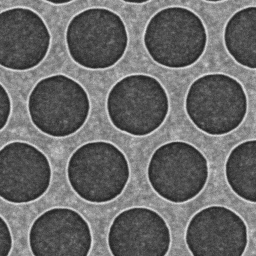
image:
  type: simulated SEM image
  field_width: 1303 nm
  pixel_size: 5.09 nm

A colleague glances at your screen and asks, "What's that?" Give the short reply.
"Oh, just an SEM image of holes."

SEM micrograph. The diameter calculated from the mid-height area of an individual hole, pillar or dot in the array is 316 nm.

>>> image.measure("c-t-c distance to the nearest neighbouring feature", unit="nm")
395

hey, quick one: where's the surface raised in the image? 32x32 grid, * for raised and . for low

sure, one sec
*******.************************
....******....******....******..
.....****......****......****...
......**........**........**....
......**........**........**....
......**........**........**....
......***.......***......****...
.....****......****......****...
*...*******..********.*********.
******..********...******...****
*****.....****......****......**
.***.......***.......**........*
.***.......**........**........*
.***.......**........**........*
.***.......***.......***.......*
.***......****......****......**
*****....*******...*******...***
*******************************.
.....*****.....*****....*****...
......***.......***......****...
......***.......***.......**....
......**........**........**....
......***.......***.......**....
......***......****......****...
.....*****.....*****....******..
********************************
******....*****....******....***
****.......***.......***......**
.***.......***.......**........*
.***.......***.......**........*
..**.......***.......**........*
.***.......***.......***......**